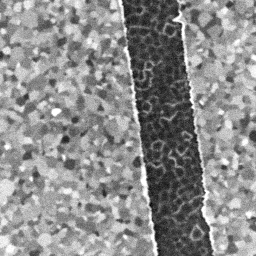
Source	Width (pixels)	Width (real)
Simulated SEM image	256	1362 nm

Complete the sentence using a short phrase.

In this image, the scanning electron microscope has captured one or a few lines or trenches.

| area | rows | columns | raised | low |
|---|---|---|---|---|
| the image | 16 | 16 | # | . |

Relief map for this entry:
########...#####
########...#####
########...#####
########....####
########....####
########....####
########....####
#########...####
#########...####
#########...####
#########....###
#########....###
#########....###
#########....###
##########...###
##########...###